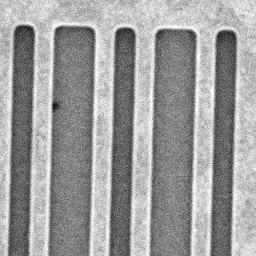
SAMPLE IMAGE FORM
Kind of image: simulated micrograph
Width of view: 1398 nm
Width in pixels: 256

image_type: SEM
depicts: groups of lines, slits or small figures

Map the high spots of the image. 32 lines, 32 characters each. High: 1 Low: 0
11111111111111111111111111111111
11111111111111111111111111111111
11111111111111111111111111111111
11001110000011101111000111111111
11001110000011000110000001100011
11001110000011000110000001100011
11001100000011000110000001100011
10001100000011000110000001100011
10001100000011000110000001100011
10001100000011000110000001100011
10001100000011000110000001100011
10001100000011000110000001100011
10001100000011000110000001100011
10001100000011000110000001100111
10001100000011000110000011100111
10001100000011000110000011100111
10001100000011000110000011000111
10001100000011000110000011000111
10001100000011000110000011000111
10001100000011000110000011000111
10001100000011000110000011000111
10001100000011000110000011000111
10001100000011000110000011000111
10001100000011000110000011000111
10001100000011000110000011000111
10001100000011000110000011000111
10001100000011000110000011000111
10001100000011000110000011000111
10001100000011000110000011000111
10001100000111001110000011000111
10001100000111001110000011000111
10001100000110001110000011000111